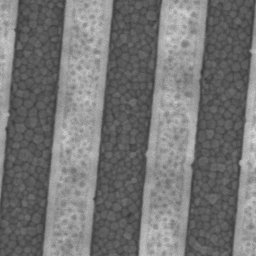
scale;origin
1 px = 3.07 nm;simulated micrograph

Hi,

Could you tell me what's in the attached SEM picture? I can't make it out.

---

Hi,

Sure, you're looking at one or a few lines or trenches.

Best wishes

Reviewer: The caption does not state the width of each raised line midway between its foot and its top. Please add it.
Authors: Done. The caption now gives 120 nanometres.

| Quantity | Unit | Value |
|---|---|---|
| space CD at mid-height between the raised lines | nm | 171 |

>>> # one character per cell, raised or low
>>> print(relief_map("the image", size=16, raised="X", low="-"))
X---XXX---XXX---
X---XXX---XXX---
X---XXX---XXX---
X---XXX---XX----
----XX----XX----
----XX----XX----
----XX----XX----
----XX----XX----
----XX----XX---X
----XX---XXX---X
---XXX---XXX---X
---XXX---XXX---X
---XXX---XXX---X
---XXX---XX----X
---XXX---XX----X
---XX----XX----X